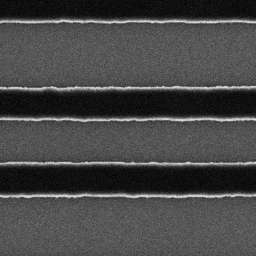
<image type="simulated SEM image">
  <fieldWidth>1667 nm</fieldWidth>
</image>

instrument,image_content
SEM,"lines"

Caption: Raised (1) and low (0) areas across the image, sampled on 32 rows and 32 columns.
11111111111111111111111111111111
11111111111111111111111111111111
11111111111111111111111111111111
00000000000000000000000000000000
00000000000000000000000000000000
00000000000000000000000000000000
00000000000000000000000000000000
00000000000000000000000000000000
00000000000000000000000000000000
00000000000000000000000000000000
00000000000000000000000000000000
11111111111111111111111111111111
11111111111111111111111111111111
11111111111111111111111111111111
11111111111111111111111111111111
00000000000000000000000000000000
00000000000000000000000000000000
00000000000000000000000000000000
00000000000000000000000000000000
00000000000000000000000000000000
11111111111111111111111111111111
11111111111111111111111111111111
11111111111111111111111111111111
11111111111111111111111111111111
11111111111011011111111111110000
00000000000000000000000000000000
00000000000000000000000000000000
00000000000000000000000000000000
00000000000000000000000000000000
00000000000000000000000000000000
00000000000000000000000000000000
00000000000000000000000000000000